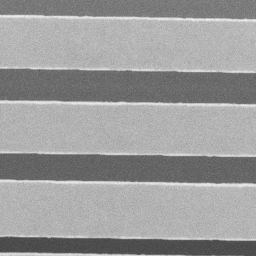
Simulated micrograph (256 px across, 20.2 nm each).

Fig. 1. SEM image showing lines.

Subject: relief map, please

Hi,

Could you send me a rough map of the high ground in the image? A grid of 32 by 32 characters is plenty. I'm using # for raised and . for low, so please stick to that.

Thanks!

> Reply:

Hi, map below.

................................
................................
#############################...
################################
################################
################################
################################
################################
...#############################
................................
................................
................................
................................
################################
################################
################################
################################
################################
################################
..........................######
................................
................................
................................
################################
################################
################################
################################
################################
################################
################################
................................
................................